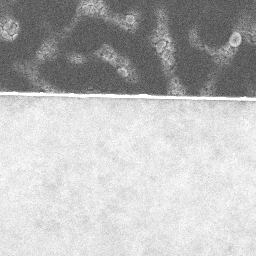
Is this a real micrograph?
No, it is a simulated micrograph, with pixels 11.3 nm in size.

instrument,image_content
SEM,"one or a few lines or trenches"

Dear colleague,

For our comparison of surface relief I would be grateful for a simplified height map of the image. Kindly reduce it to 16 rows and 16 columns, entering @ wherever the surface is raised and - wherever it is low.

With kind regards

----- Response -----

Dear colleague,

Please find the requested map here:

@@@@@@@@@@@@@@@@
@@@@@@@@@@@@@@@@
@@@@@@@@@@@@@@@@
@@@@@@@@@@@@@@@@
@@@@@@@@@@@@@@@@
@@@@@@@@@@@@@@@@
----------------
----------------
----------------
----------------
----------------
----------------
----------------
----------------
----------------
----------------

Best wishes